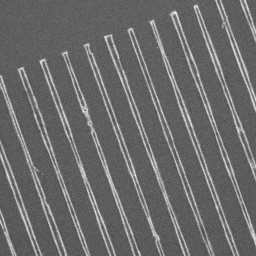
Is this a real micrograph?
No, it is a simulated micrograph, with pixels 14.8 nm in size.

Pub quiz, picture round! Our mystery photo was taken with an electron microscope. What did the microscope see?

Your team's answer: parallel lines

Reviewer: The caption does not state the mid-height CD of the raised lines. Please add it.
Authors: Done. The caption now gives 55.5 nanometers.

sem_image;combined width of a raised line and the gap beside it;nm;342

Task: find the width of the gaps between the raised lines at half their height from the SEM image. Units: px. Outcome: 19.6